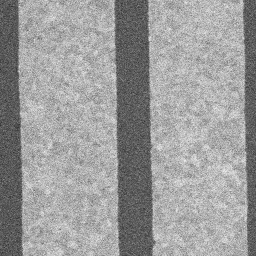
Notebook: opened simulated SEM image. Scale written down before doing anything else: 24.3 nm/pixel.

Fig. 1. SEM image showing one or a few lines or trenches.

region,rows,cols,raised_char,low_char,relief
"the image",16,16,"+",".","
.++++++..++++++.
.++++++..++++++.
.++++++..++++++.
.++++++..++++++.
.++++++..++++++.
.++++++..++++++.
.++++++..++++++.
.++++++..++++++.
.++++++..++++++.
.++++++..++++++.
.++++++..++++++.
.++++++...+++++.
.++++++...+++++.
.++++++...+++++.
.++++++...+++++.
.++++++...+++++.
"